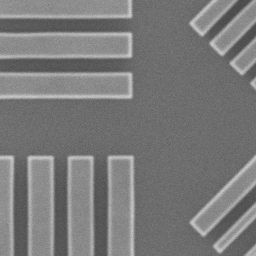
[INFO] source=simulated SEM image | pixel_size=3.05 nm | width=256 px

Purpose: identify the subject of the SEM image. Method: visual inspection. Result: groups of lines, slits or small figures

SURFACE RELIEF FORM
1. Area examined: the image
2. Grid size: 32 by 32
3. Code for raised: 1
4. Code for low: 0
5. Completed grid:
11111111111111110000000000111001
11111111111111110000000001110011
00000000000000000000000011100111
00000000000000000000000011001110
11111111111111110000000000011100
11111111111111110000000000111001
11111111111111110000000000010011
00000000000000000000000000000111
00000000000000000000000000000110
11111111111111110000000000000000
11111111111111110000000000000000
11111111111111110000000000000000
00000000000000000000000000000000
00000000000000000000000000000000
00000000000000000000000000000000
00000000000000000000000000000000
00000000000000000000000000000000
00000000000000000000000000000000
00000000000000000000000000000000
00000000000000000000000000000000
11001110011100111000000000000001
11001110011100111000000000000011
11001110011100111000000000000111
11001110011100111000000000001111
11001110011100111000000000011110
11001110011100111000000000111100
11001110011100111000000001111001
11001110011100111000000011110011
11001110011100111000000011100110
11001110011100111000000000001100
11001110011100111000000000011000
11001110011100111000000000000001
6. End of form